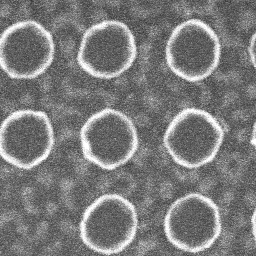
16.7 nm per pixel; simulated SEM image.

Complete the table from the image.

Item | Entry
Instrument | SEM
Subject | raised bodies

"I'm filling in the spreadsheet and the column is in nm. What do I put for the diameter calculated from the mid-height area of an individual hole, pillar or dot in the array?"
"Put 916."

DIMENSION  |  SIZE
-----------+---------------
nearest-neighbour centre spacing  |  1410 nm